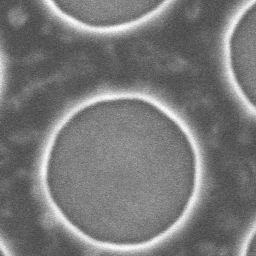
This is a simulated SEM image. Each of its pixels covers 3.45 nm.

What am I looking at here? holes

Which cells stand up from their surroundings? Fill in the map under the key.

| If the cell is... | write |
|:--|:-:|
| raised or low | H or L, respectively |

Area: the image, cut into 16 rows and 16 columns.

HHHHLLLLLLHHHHHL
HHHHHLLLHHHHHHHL
HHHHHHHHHHHHHHLL
HHHHHHHHHHHHHHLL
HHHHHHHHHHHHHHLL
HHHHHHHHHHHHHHHL
HHHHHHLLLLHHHHHH
HHHHLLLLLLLHHHHH
HHHLLLLLLLLLHHHH
HHHLLLLLLLLLHHHH
HHHLLLLLLLLLHHHH
HHHLLLLLLLLLHHHH
HHHLLLLLLLLLHHHH
HHHHLLLLLLLHHHHH
HHHHHLLLLLHHHHHH
HHHHHHHHHHHHHHHL